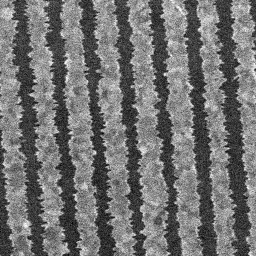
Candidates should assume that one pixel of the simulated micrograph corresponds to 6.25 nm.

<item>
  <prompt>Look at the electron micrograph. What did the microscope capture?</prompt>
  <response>parallel lines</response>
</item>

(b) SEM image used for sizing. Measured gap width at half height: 97.4 nm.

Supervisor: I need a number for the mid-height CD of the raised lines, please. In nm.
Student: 116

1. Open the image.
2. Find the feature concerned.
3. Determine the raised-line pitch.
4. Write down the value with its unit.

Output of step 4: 212 nanometres